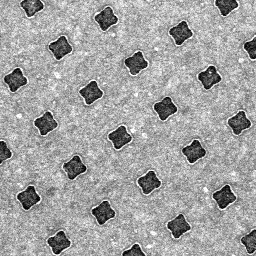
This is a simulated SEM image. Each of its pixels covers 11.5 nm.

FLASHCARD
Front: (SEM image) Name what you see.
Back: a regular array of holes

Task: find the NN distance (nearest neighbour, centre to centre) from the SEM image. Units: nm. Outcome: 610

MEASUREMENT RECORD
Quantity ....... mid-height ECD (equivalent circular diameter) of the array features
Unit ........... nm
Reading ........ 246